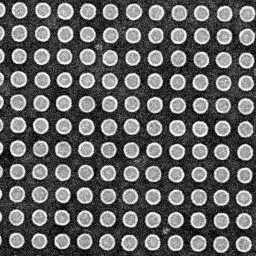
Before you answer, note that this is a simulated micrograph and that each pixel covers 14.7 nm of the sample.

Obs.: a regular array of raised bodies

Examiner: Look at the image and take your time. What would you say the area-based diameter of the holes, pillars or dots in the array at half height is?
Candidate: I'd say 0.214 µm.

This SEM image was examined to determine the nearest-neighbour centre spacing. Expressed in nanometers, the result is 331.